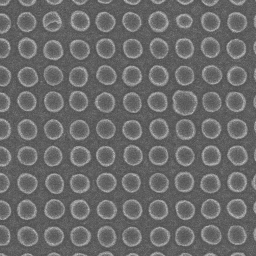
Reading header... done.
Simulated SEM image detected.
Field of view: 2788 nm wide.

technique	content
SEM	a regular array of raised bodies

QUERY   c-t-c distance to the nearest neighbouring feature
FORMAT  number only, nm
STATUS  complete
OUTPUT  278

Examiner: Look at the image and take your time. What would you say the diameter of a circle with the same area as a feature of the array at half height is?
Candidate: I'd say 205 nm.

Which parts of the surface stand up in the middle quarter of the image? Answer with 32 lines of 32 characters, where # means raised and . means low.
................................
..###...####...####...###...####
.#####..#####..####..#####..####
.#####..#####..####...####..####
..####...####..####...###...####
...##...........................
................................
..###....##.....##....###...####
.#####..####...####..####..#####
.#####..#####..####..#####.#####
..####..####...####..#####.#####
...##....###....###....##...####
.............................###
................................
...##....###....##....###....###
..####..#####..####..#####..####
..####..#####..####...####..####
..####...####..####...####..####
...##.....#.....##.....#......#.
................................
................................
..####...###...####...####..####
..####..#####..####..#####..####
..####..#####..####..#####..####
..####...###....###...###....###
..........#.....................
................................
..........#............#.....##.
..####...####..####...####..####
..####..#####..####..#####..####
..####...####..####...####..####
..###.....##....##....###....##.